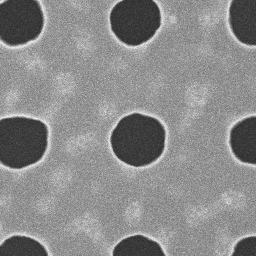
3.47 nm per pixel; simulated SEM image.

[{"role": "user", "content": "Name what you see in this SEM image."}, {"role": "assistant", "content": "holes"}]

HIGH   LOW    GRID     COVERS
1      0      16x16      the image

0001111000111100
0001111000111100
0011111101111110
1111111111111111
1111111111111111
1111111111111111
1111111111111111
0011111100111110
0001111000111100
0001111000111110
1111111111111111
1111111111111111
1111111111111111
1111111111111111
1111111111111111
0001111000111110